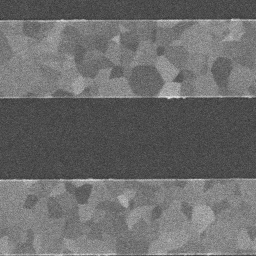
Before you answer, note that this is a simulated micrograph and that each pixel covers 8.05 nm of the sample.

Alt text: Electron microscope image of one or a few lines or trenches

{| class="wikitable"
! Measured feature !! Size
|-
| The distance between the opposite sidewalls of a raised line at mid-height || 616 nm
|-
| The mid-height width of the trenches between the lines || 666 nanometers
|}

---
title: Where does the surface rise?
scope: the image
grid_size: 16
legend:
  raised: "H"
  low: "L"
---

LLLLLLLLLLLLLLLL
HHHHHHHHHHHHHHHH
HHHHHHHHHHHHHHHH
HHHHHHHHHHHHHHHH
HHHHHHHHHHHHHHHH
HHHHHHHHHHHHHHHH
LLLLLLLLLLLLLLLL
LLLLLLLLLLLLLLLL
LLLLLLLLLLLLLLLL
LLLLLLLLLLLLLLLL
LLLLLLLLLLLLLLLL
HHHHHHHHHHHHHHHH
HHHHHHHHHHHHHHHH
HHHHHHHHHHHHHHHH
HHHHHHHHHHHHHHHH
HHHHHHHHHHHHHHHH